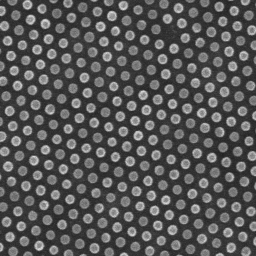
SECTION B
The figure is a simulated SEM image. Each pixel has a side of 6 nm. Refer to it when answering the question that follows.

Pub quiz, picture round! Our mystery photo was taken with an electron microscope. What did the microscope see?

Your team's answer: a regular array of raised bodies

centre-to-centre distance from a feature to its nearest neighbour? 90.8 nm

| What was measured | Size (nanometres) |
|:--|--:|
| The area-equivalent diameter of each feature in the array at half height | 56.2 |